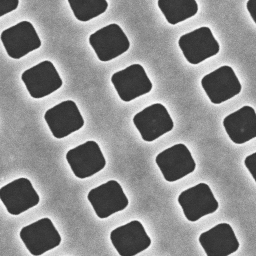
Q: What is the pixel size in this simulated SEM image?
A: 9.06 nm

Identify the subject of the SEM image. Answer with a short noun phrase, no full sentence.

a regular array of holes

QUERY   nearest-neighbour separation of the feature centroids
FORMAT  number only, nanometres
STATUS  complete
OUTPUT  409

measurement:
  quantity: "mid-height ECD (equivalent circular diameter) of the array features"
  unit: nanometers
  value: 333